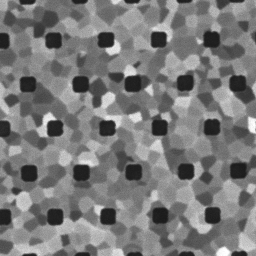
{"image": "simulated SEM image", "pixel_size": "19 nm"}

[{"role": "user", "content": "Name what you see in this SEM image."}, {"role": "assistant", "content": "a regular array of holes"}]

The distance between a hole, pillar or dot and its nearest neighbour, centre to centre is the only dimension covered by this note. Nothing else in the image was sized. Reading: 0.966 micrometres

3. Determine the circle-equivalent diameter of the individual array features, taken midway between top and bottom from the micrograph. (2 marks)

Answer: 347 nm